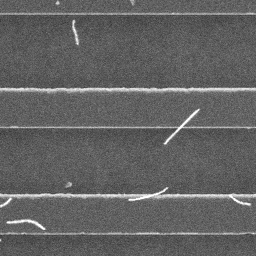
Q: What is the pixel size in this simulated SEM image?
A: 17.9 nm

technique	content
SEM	lines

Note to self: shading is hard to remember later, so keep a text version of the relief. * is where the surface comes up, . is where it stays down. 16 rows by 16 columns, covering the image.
****************
................
................
................
................
................
****************
****************
................
................
................
................
****************
****************
****************
................